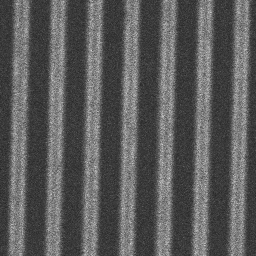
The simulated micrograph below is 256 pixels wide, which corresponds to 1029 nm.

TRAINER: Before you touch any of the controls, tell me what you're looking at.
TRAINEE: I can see parallel lines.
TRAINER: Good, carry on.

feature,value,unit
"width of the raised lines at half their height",64.2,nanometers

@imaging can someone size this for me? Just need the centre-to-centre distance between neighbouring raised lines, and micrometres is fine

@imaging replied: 0.147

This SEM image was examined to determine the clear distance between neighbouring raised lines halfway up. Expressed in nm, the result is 84.3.